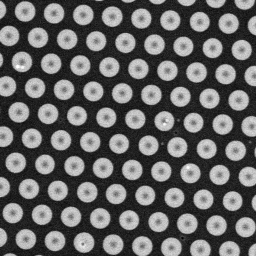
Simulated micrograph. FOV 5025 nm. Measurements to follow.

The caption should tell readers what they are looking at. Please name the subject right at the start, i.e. an array of small figures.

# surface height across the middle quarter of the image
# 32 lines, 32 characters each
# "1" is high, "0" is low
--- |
00111100011111001111100011110001
00111100011111001111100111110001
00011000001110000111100011110001
00000000000000000010000011110001
10000000000000000000000000000000
11000111100001110000011000000000
11000111110011111000111100011110
11000111110011111001111100011110
10000011100011111001111100011110
00000000000001110000111100011110
00000000000000000000000000001100
01111000011100000100000000000000
01111100111110001111000011100001
01111100111110011111000111100011
01111000111110011111000111100011
00000000011100001110000111100011
00000000000000000000000011000001
10000111000000000000000000000000
11001111100011110000111000001000
11001111100111110001111000111100
10001111100111110001111000111110
00000111000011110001111000111110
00000000000000000000110000011100
01110000000000000000000000000000
11111000111100001100000000000000
11111001111100011110001111000011
11111001111100011110001111100111
01110000111100011110001111100111
00000000000000001110001111000011
00000000000000000000000000000001
10001111000011000000000000000000
10011111000111100011110000111000